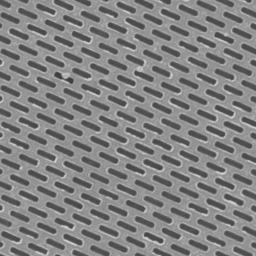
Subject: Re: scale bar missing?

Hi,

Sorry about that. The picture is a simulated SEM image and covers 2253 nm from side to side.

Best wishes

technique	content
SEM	a regular array of holes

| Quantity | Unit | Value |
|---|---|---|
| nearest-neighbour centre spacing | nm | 159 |